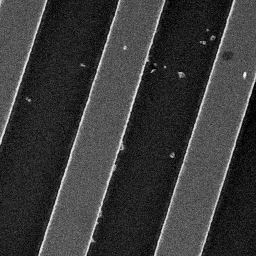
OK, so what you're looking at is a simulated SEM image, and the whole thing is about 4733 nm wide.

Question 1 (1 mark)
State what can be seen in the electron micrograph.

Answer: lines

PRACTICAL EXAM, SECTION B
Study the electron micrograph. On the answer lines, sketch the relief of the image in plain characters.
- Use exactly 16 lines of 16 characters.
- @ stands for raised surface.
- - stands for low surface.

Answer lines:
@@@----@@@----@@
@@-----@@@----@@
@@-----@@@----@@
@@----@@@-----@@
@@----@@@----@@@
@-----@@@----@@@
@----@@@-----@@-
-----@@@----@@@-
-----@@@----@@@-
----@@@-----@@@-
----@@@----@@@--
----@@@----@@@--
----@@-----@@@--
---@@@----@@@---
---@@@----@@@---
---@@@----@@@---